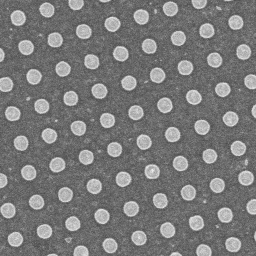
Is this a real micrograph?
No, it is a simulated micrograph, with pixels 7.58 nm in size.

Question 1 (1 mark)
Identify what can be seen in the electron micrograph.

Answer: a regular array of raised bodies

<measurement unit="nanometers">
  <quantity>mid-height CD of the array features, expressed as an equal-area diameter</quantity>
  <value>111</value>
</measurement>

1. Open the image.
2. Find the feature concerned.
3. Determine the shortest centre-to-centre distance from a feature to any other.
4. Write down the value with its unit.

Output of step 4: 225 nanometres